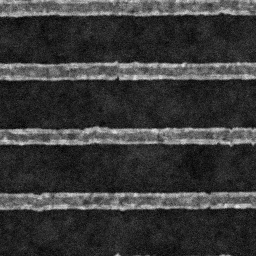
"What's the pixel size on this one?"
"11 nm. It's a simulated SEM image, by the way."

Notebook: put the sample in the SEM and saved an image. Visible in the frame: one or a few lines or trenches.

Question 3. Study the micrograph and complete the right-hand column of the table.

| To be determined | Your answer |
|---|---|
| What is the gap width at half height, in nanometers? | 557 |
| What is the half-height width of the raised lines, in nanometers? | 158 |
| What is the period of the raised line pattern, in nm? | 709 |